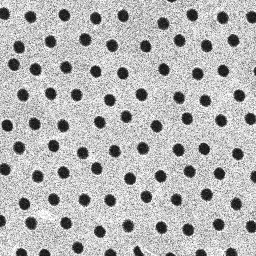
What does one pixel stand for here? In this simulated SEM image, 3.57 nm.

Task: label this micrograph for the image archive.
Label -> a regular array of holes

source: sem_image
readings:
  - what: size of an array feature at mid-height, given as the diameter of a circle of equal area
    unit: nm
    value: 42.6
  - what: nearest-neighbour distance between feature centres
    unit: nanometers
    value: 92.2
